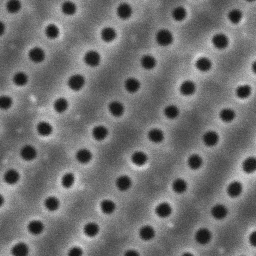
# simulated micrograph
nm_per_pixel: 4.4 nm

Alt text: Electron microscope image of a regular array of holes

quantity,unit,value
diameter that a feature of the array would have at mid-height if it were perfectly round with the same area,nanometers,70.3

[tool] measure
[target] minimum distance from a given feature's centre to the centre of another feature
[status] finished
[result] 125 nm